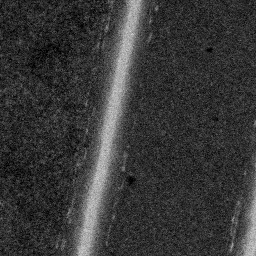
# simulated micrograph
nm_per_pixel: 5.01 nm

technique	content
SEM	one or a few lines or trenches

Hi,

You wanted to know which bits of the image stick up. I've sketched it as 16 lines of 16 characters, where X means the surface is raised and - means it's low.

--------XXXXXXXX
--------XXXXXXXX
--------XXXXXXXX
--------XXXXXXXX
--------XXXXXXXX
-------XXXXXXXXX
-------XXXXXXXXX
-------XXXXXXXXX
-------XXXXXXXXX
-------XXXXXXXXX
------XXXXXXXXXX
------XXXXXXXXXX
------XXXXXXXXXX
------XXXXXXXXXX
-----XXXXXXXXXXX
-----XXXXXXXXXXX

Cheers